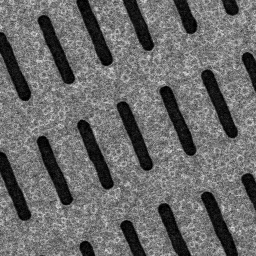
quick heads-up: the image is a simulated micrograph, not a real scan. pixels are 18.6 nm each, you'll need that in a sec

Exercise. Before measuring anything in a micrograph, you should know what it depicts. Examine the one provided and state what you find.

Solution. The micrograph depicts holes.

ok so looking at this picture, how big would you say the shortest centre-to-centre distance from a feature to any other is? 826 nm